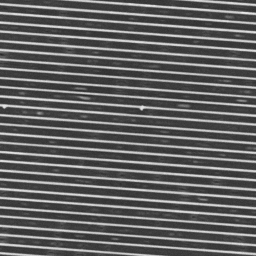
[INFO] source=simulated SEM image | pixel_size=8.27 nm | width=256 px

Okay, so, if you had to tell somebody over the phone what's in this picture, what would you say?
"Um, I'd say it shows parallel lines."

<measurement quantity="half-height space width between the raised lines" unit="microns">0.0588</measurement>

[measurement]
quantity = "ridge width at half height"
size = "14.4 nm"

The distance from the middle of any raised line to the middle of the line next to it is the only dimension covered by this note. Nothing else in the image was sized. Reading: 9.21 px